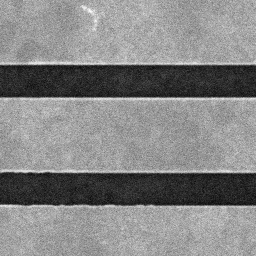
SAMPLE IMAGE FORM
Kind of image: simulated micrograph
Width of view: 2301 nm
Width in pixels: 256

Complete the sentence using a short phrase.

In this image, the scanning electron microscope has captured lines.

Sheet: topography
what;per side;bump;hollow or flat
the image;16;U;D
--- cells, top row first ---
UUUUUUUUUUUUUUUU
UUUUUUUUUUUUUUUU
UUUUUUUUUUUUUUUU
UUUUUUUUUUUUUUUU
DDDDDDDDDDDDDDDD
DDDDDDDDDDDDDDDD
UUUUUUUUUUUUUUUU
UUUUUUUUUUUUUUUU
UUUUUUUUUUUUUUUU
UUUUUUUUUUUUUUUU
UUUUUUUUUUUUUUUU
DDDDDDDDDDDDDDDD
DDDDDDDDDDDDDDDD
UUUUUUUUUUUUUUUU
UUUUUUUUUUUUUUUU
UUUUUUUUUUUUUUUU